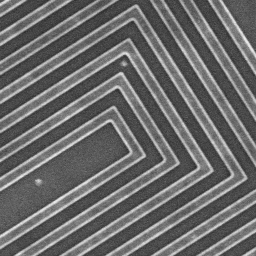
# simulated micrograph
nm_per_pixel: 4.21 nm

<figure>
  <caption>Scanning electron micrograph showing groups of lines, slits or small figures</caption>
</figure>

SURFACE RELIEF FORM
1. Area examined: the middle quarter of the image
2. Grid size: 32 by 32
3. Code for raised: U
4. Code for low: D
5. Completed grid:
DDDDDDUUUUDDDDDDDDUUUDDDDUUUDDDD
DDDDUUUUDDDDDDDDDDUUUDDDDDUUUDDD
DDUUUUUDDDDDDDDDDDDUUUDDDDUUUDDD
DUUUUDDDDDDDUUUDDDDDUUDDDDDUUUDD
UUUUDDDDDDUUUUUUDDDDUUUDDDDDUUDD
UUDDDDDDDUUUUUUUDDDDDUUUDDDDUUUD
UDDDDDDUUUUUDDUUUDDDDDUUDDDDDUUU
DDDDDDUUUUDDDDDUUUDDDDUUUDDDDUUU
DDDDUUUUUDDDDDDUUUDDDDDUUUDDDDUU
DDDUUUUUDDDDDDDDUUUDDDDUUUDDDDDU
DUUUUUDDDDDDDDDDDUUUDDDDUUUDDDDU
UUUUDDDDDDDUUDDDDUUUDDDDDUUUDDDD
UUDDDDDDDUUUUUDDDDUUUDDDDUUUDDDD
UDDDDDDDUUUUUUDDDDDUUUDDDDUUUDDD
DDDDDDUUUUUDUUUDDDDUUUDDDDDUUDDD
DDDDDUUUUDDDDUUDDDDDUUUDDDDUUUDD
DDDUUUUUDDDDDUUUDDDDDUUDDDDDUUUD
DUUUUUDDDDDDDDUUUDDDDUUUDDDDDUUD
UUUUDDDDDDDDDDDUUUDDDDUUUDDDDUUU
UUUDDDDDDDDDDDDUUUDDDDUUUDDDDDUU
UDDDDDDDDDDDDDDDUUUDDDDUUUDDDDUU
DDDDDDDDDDDDDDDDUUUDDDDDUUUDDDDU
DDDDDDDDDDDDDDDDUUUUDDDDUUUDDDDD
DDDDDDDDDDDDDDDUUUUUDDDDDUUUDDDD
DDDDDDDDDDDDDUUUUUDDDDDDDUUUUDDD
DDDDDDDDDDDDUUUUDDDDDDDUUUUUDDDD
DDDDDDDDDDUUUUUDDDDDDDUUUUDDDDDD
DDDDDDDDDUUUUDDDDDDDUUUUUDDDDDDU
DDDDDDDUUUUUDDDDDDDUUUUDDDDDDDUU
DDDDDDUUUUDDDDDDDUUUUUDDDDDDDUUU
DDDDUUUUUDDDDDDUUUUUDDDDDDDUUUUD
DDUUUUUDDDDDDDUUUUDDDDDDDUUUUDDD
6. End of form